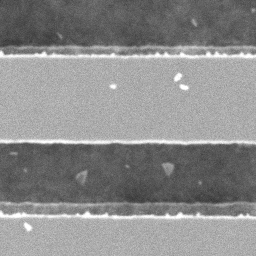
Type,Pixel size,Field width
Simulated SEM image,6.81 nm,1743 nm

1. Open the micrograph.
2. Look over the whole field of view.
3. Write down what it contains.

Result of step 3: lines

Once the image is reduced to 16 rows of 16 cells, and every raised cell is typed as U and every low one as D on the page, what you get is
DDDDDDDDDDDDDDDD
DDDDDDDDDDDDDDDD
DDDDDDDDDDDDDDDD
UUUUUUUUUUUUUUUU
UUUUUUUUUUUUUUUU
UUUUUUUUUUUUUUUU
UUUUUUUUUUUUUUUU
UUUUUUUUUUUUUUUU
UUUUUUUUUUUUUUUU
DDDDDDDDDDDDDDDD
DDDDDDDDDDDDDDDD
DDDDDDDDDDDDDDDD
DDDDDDDDDDDDDDDD
UUUUUUUUUUUUUUUU
UUUUUUUUUUUUUUUU
UUUUUUUUUUUUUUUU